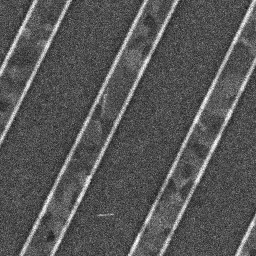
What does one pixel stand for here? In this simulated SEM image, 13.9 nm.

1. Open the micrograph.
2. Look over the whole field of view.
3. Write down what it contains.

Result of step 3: one or a few lines or trenches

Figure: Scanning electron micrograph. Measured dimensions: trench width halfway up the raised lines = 0.977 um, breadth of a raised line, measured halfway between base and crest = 377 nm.